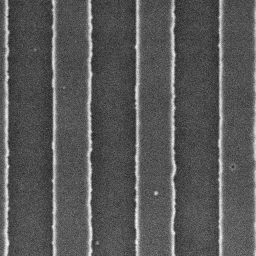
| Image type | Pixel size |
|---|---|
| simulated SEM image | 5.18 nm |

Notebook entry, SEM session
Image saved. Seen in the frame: lines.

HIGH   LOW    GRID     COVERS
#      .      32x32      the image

#......####......#####......####
#......####......#####......####
#......####......#####......####
#......####......#####.....#####
#......####......#####......####
#......####......#####.....#####
#......####......#####......####
#......####......#####......####
#......####......#####......####
#......####......#####......####
#......####......#####......####
#......####......#####......####
#......####......#####......####
#......####......#####......####
#......####......#####......####
#......####......#####......####
#......####......#####......####
#......####......#####.....#####
#......####......#####.....#####
#......####......#####......####
#......####......#####.....#####
#......####......#####......####
#......####......#####.....#####
#......####......#####......####
#......####......#####......####
#......####......#####......####
#......####......#####......####
#......####......#####......####
#......####......#####......####
#......####......#####......####
#......####......#####......####
#......####......#####......####